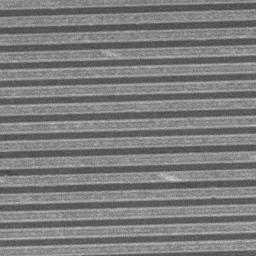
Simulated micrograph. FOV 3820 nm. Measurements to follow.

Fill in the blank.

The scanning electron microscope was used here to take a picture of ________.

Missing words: parallel lines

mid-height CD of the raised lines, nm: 140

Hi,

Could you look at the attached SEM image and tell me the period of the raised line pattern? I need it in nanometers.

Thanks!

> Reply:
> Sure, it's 264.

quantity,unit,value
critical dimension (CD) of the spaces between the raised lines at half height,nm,125